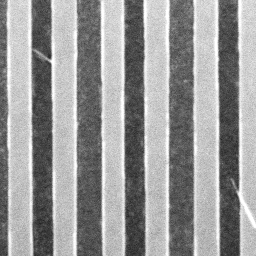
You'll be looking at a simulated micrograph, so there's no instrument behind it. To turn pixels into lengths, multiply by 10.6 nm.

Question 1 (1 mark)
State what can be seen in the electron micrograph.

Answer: lines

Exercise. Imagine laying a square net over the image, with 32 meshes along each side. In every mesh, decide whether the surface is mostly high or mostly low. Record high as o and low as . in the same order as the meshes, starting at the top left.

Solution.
.ooo..ooo....oo...ooo...ooo...oo
.ooo...oo....oo...ooo...ooo...oo
.ooo...oo....oo...ooo...ooo...oo
.ooo...oo....oo...ooo...ooo...oo
.ooo...oo....oo...ooo...ooo...oo
.ooo...oo....oo...ooo...ooo...oo
.ooo...oo....oo...ooo...ooo...oo
.ooo..ooo....oo...ooo...ooo...oo
.ooo...oo....oo...ooo...ooo...oo
.ooo...oo....oo...ooo...ooo...oo
.ooo...oo....oo...ooo...ooo...oo
.ooo...oo....oo...ooo...ooo...oo
.ooo...oo....oo...ooo...ooo...oo
.ooo...oo....oo...ooo...ooo...oo
.ooo...oo....oo...ooo...ooo...oo
.ooo...oo....oo...ooo...ooo...oo
.ooo...oo....oo...ooo...ooo...oo
.ooo...oo....oo...ooo...ooo...oo
.ooo...oo....oo...ooo...ooo...oo
.ooo...oo....oo...ooo...ooo...oo
.ooo...oo....oo...ooo...ooo...oo
.ooo...oo....oo...ooo...ooo...oo
.ooo...oo....oo...ooo...ooo...oo
.ooo...oo....oo...ooo...ooo...oo
.ooo...oo....oo...ooo...ooo...oo
.ooo...oo....oo...ooo...ooo...oo
.ooo...oo....oo...ooo...ooo...oo
.ooo...oo....ooo..ooo...ooo...oo
.ooo...oo....ooo..ooo...ooo...oo
.ooo...oo....ooo..ooo...ooo...oo
.ooo...oo....ooo..ooo...ooo...oo
.ooo...oo....ooo..ooo...ooo...oo